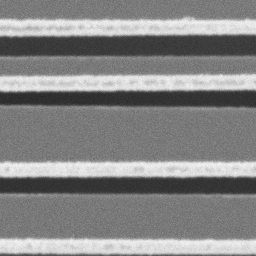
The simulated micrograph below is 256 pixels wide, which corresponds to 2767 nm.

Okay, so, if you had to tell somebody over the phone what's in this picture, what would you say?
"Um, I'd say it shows lines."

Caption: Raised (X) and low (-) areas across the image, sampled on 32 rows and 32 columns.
XXXXXXXXXXXXXXXXXXXXXXXXXXXXXXXX
XXXXXXXXXXXXXXXXXXXXXXXXXXXXXXXX
XXXXXXXXXXXXXXXXXXXXXXXXXXXXXXXX
XXXXXXXXXXXXXXXXXXXXXXXXXXXXXXXX
-XX-----------------------------
--------------------------------
--------------------------------
XXXXXXXXXXXXXXXXXXXXXXXXXXXXXXXX
XXXXXXXXXXXXXXXXXXXXXXXXXXXXXXXX
XXXXXXXXXXXXXXXXXXXXXXXXXXXXXXXX
XXXXXXXXXXXXXXXXXXXXXXXXXXXXXXXX
--------------------------------
--------------------------------
XXXXXXXXXXXXXXXXXXXXXXXXXXX-X-X-
XXXXXXXXXXXXXXXXXXXXXXXXXXXXXXXX
XXXXXXXXXXXXXXXXXXXXXXXXXXXXXXXX
XXXXXXXXXXXXXXXXXXXXXXXXXXXXXXXX
XXXXXXXXXXXXXXXXXXXXXXXXXXXXXXXX
XXXXXXXXXXXXXXXXXXXXXXXXXXXXXXXX
XXXXXXXXXXXXXXXXXXXXXXXXXXXXXXXX
XXXXXXXXXXXXXXXXXXXXXXXXXXXXXXXX
XXXXXXXXXXXXXXXXXXXXXXXXXXXXXXXX
--------------------------------
--------------------------------
XXXXXXXXXXXXXXXXXXXXXXXXXXXXXXXX
XXXXXXXXXXXXXXXXXXXXXXXXXXXXXXXX
XXXXXXXXXXXXXXXXXXXXXXXXXXXXXXXX
XXXXXXXXXXXXXXXXXXXXXXXXXXXXXXXX
XXXXXXXXXXXXXXXXXXXXXXXXXXXXXXXX
XXXXXXXXXXXXXXXXXXXXXXXXXXXXXXXX
XXXXXXXXXXXXXXXXXXXXXXXXXXXXXXXX
XXXXXXXXXXXXXXXXXXXXXXXXXXXXXXXX